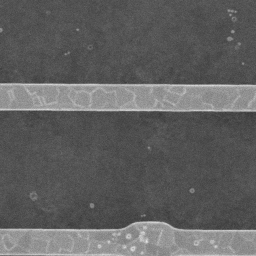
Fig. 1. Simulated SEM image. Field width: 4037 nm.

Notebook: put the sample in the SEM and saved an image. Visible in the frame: wiring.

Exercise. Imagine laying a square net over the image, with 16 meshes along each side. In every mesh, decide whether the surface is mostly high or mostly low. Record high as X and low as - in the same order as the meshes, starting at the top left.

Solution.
----------------
----------------
----------------
----------------
----------------
XXXXXXXXXXXXXXXX
XXXXXXXXXXXXXXXX
----------------
----------------
----------------
----------------
----------------
----------------
----------------
XXXXXXXXXXXXXXXX
XXXXXXXXXXXXXXXX